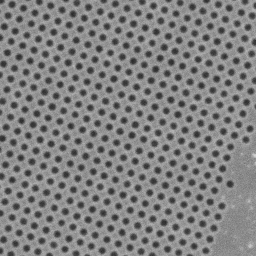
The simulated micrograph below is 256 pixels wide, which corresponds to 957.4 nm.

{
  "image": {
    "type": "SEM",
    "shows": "a regular array of holes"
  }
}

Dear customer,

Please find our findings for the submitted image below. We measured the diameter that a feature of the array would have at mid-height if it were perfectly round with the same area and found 27.7 nm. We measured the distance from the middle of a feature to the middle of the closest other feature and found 43.2 nm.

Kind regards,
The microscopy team